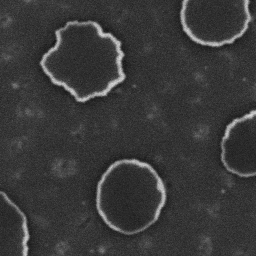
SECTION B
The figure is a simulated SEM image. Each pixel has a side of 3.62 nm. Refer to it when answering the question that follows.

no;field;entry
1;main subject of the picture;raised bodies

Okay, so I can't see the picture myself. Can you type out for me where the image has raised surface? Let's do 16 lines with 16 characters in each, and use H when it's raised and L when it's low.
LLLLLLLLLLLHHHHH
LLLLHHLLLLLHHHHL
LLLLHHHLLLLLHHHL
LLLHHHHHLLLLLLLL
LLLHHHHHLLLLLLLL
LLLLHHHLLLLLLLLL
LLLLLLLLLLLLLLLL
LLLLLLLLLLLLLLLH
LLLLLLLLLLLLLLHH
LLLLLLLLLLLLLLHH
LLLLLLLHHLLLLLHH
LLLLLLHHHHLLLLLL
HLLLLLHHHHLLLLLL
HLLLLLHHHHLLLLLL
HHLLLLLLHLLLLLLL
HHLLLLLLLLLLLLLL